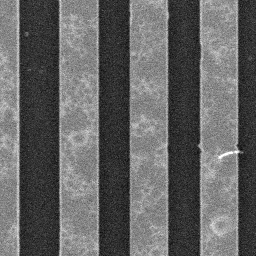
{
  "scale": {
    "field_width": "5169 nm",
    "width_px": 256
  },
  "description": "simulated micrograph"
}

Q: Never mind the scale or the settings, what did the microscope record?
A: one or a few lines or trenches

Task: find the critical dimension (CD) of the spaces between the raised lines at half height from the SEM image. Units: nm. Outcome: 681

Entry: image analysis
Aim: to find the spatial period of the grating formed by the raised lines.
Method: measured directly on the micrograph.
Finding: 1410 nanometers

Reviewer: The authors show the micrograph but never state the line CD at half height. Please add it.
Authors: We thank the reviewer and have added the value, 36.4 px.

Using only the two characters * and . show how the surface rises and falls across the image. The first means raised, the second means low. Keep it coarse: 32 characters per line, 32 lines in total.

**......****....*****....*****..
**......****....*****....*****..
**......****....*****....*****..
**......****....*****....*****..
**......****....*****....*****..
**......****....*****....*****..
**......****....*****....*****..
**......****....*****....*****..
**......****....*****....*****..
**......****....*****....*****..
**......****....*****....*****..
**......****....*****....*****..
**......****....*****....*****..
**......****....*****....*****..
**......****....*****....*****..
**......****....*****....*****..
**......****....*****....*****..
**......****....*****....*****..
**......****....*****....*****..
**......****....*****....*****..
**......****....*****....*****..
**......****....*****....*****..
**......****....*****....*****..
**......****....*****....*****..
**......****....*****....*****..
**......****....*****....*****..
**......****....*****....*****..
**......****....*****....*****..
**......****....*****....*****..
**......****....*****....*****..
**......****....*****....*****..
**......****....*****....*****..